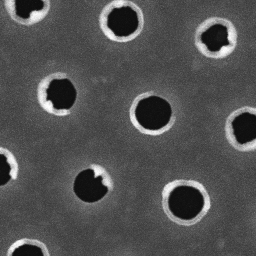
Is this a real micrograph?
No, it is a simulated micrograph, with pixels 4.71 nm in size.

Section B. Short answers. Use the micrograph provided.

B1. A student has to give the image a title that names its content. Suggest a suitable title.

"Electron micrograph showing holes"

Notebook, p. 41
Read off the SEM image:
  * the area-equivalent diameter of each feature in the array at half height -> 149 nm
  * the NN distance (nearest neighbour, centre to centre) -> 442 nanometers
